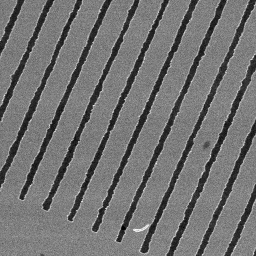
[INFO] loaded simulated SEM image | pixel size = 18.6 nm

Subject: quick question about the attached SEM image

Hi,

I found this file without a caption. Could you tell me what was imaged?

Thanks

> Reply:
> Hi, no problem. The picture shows parallel lines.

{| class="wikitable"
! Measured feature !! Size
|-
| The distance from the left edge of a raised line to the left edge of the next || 492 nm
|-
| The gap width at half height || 121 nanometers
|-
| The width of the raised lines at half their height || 374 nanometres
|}